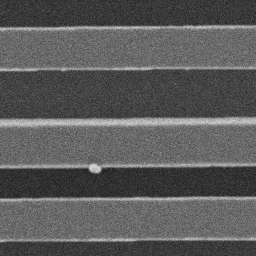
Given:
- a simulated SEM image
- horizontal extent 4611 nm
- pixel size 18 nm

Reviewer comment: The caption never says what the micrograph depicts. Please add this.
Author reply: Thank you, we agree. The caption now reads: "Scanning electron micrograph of lines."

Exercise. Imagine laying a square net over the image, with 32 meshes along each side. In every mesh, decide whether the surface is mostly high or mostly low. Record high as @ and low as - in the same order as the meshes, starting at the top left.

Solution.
--------------------------------
--------------------------------
--------------------------------
@@@@@@@@@@@@@@@@@@@@@@@@@@@@@@@@
@@@@@@@@@@@@@@@@@@@@@@@@@@@@@@@@
@@@@@@@@@@@@@@@@@@@@@@@@@@@@@@@@
@@@@@@@@@@@@@@@@@@@@@@@@@@@@@@@@
@@@@@@@@@@@@@@@@@@@@@@@@@@@@@@@@
@@@@@@@@@@@@@@@@@@@@@@@@@@@@@@@@
--------------------------------
--------------------------------
--------------------------------
--------------------------------
--------------------------------
--------------------------------
@@@@@@@@@@@@@@@@@@@@@@@@@@@@@@@@
@@@@@@@@@@@@@@@@@@@@@@@@@@@@@@@@
@@@@@@@@@@@@@@@@@@@@@@@@@@@@@@@@
@@@@@@@@@@@@@@@@@@@@@@@@@@@@@@@@
@@@@@@@@@@@@@@@@@@@@@@@@@@@@@@@@
@@@@@@@@@@@@@@@@@@@@@@@@@@@@@@@@
--------------------------------
--------------------------------
--------------------------------
--------------------------------
@@@@@@@@@@@@@@@@@@@@@@@@@@@@@@@@
@@@@@@@@@@@@@@@@@@@@@@@@@@@@@@@@
@@@@@@@@@@@@@@@@@@@@@@@@@@@@@@@@
@@@@@@@@@@@@@@@@@@@@@@@@@@@@@@@@
@@@@@@@@@@@@@@@@@@@@@@@@@@@@@@@@
--------------------------------
--------------------------------